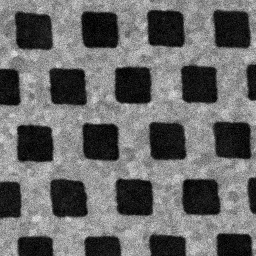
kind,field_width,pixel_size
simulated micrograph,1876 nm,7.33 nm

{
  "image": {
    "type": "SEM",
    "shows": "a regular array of holes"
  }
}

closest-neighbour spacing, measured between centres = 475 nm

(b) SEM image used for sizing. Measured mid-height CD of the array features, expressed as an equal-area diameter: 297 nm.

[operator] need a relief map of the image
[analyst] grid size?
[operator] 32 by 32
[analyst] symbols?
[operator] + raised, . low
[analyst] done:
++++++++++++++++++++++++++++++++
++.++++++++.+++++++...+++++....+
++....++++.....+++.....++++....+
++....++++.....+++.....++++....+
++.....+++.....+++.....++++....+
++.....++++....++++....++++....+
++++++++++++++++++++++++++++++++
++++++++++++++++++++++++++++++++
+++++++++++++++...+++++....++++.
..++++.....+++.....++++....++++.
..++++.....+++.....++++....++++.
...+++.....+++.....++++....++++.
...+++.....++++....++++....++++.
++++++++++++++++++++++++++++++++
++++++++++++++++++++++++++++++++
+++++++++++.+.+++++....++++....+
++.....+++.....++++....++++....+
++.....+++.....++++....++++....+
++.....+++.....++++....++++....+
++.....++++....++++....++++....+
++++++++++++++++++++++++++++++++
++++++++++++++++++++++++++++++++
+++++++..++++++...+++++....++++.
...+++.....++++....++++....++++.
...+++.....++++....++++....++++.
...+++.....++++....++++.....+++.
...++++....++++....++++....+++++
++++++++++++++++++++++++++++++++
++++++++++++++++++++++++++++++++
+++++++++++++.+++++...+++++....+
++.....+++.....++++....++++.....
++.....++++....++++....++++.....